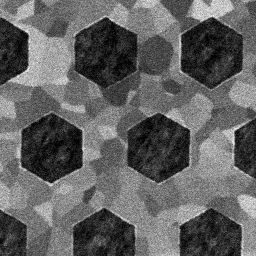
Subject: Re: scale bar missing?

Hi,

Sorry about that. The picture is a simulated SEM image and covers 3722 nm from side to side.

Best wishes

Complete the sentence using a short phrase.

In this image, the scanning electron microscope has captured holes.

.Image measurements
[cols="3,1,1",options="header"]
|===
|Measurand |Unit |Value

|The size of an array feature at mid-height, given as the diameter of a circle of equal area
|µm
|0.968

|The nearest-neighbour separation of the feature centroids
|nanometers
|1540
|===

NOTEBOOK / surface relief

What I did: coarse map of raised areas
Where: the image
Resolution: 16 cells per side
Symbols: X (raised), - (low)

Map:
XXXXXXXXXXXXXXXX
-XXXXX-XXXXX--XX
--XXX----XX----X
--XXX----XX----X
-XXXX---XXX----X
XXXXXXXXXXXXXXXX
XXXXXXXXXXXXXXXX
XX--XXXXX--XXXXX
X----XXX----XXX-
X----XXX----XXX-
XX---XXX----XXX-
XXXXXXXXXXXXXXXX
XXXXXXXXXXXXXXXX
-XXXXX-XXXXX--XX
--XXX---XXX----X
--XXX---XXX----X